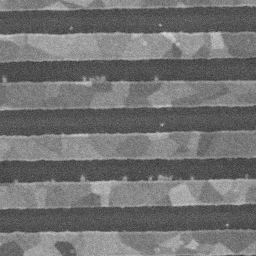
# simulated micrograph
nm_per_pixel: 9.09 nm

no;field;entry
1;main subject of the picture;lines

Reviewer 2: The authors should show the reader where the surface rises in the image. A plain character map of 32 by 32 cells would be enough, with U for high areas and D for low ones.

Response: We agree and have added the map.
UUUUUUUUUUUUUUUUUUUUUUUUUUUUUUUU
DDDDDDDDDDDDDDDDDDDDDDDDDDDDDDDD
DDDDDDDDDDDDDDDDDDDDDDDDDDDDDDDD
DDDDDDDDDDDDDDDDDDDDDDDDDDDDDDDD
UUUUUUUUUUUUUUUUUUUUUUUUUUUUUUUU
UUUUUUUUUUUUUUUUUUUUUUUUUUUUUUUU
UUUUUUUUUUUUUUUUUUUUUUUUUUUUUUUU
UUUUUUUUUUDDDDDDDDDDDDDDDDDDDDDD
DDDDDDDDDDDDDDDDDDDDDDDDDDDDDDDD
DDDDDDDDDDDDDDDDDDDDDDDDDDDDDDDD
UUUUUUUUUUUUUUUUUUUUUUUUUUUUUUUU
UUUUUUUUUUUUUUUUUUUUUUUUUUUUUUUU
UUUUUUUUUUUUUUUUUUUUUUUUUUUUUUUU
UUUUUUUUUUDUUDDDDDDDDDDDDDDDDDDD
DDDDDDDDDDDDDDDDDDDDDDDDDDDDDDDD
DDDDDDDDDDDDDDDDDDDDDDDDDDDDDDDD
DDDDDDDDDDDDDDDDDDDDDDUUUUDUUUUU
UUUUUUUUUUUUUUUUUUUUUUUUUUUUUUUU
UUUUUUUUUUUUUUUUUUUUUUUUUUUUUUUU
UUUUUUUUUUUUUUUUUUUUUUUUUUUUUUUU
DDDDDDDDDDDDDDDDDDDDDDDDDDDDDDDD
DDDDDDDDDDDDDDDDDDDDDDDDDDDDDDDD
DDDDDDDDDDDDDDDDDDDDDDDDDDDDDUUD
UUUUUUUUUUUUUUUUUUUUUUUUUUUUUUUU
UUUUUUUUUUUUUUUUUUUUUUUUUUUUUUUU
UUUUUUUUUUUUUUUUUUUUUUUUUUUUDUDD
DDDDDDDDDDDDDDDDDDDDDDDDDDDDDDDD
DDDDDDDDDDDDDDDDDDDDDDDDDDDDDDDD
DDDDDDDDDDDDDDDDDDDDDDDDDDDDDDDD
UUUUUUUUUUUUUUUUUUUUUUUUUUUUUUUU
UUUUUUUUUUUUUUUUUUUUUUUUUUUUUUUU
UUUUUUUUUUUUUUUUUUUUUUUUUUUUUUUU